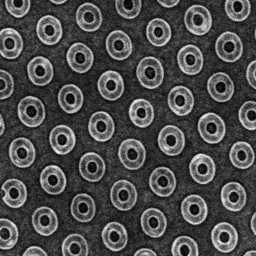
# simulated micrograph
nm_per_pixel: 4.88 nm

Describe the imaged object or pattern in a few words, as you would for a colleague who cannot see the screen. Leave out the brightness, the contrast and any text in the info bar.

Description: a regular array of ring-shaped raised bodies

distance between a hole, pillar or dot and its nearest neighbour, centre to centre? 199 nm